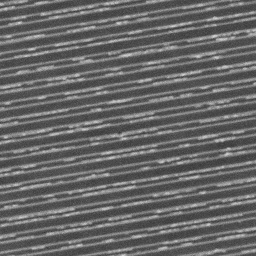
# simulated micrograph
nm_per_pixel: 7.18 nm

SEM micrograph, parallel lines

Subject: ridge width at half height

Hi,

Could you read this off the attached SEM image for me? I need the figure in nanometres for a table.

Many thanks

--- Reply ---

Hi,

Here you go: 54.9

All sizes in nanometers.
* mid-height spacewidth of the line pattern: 62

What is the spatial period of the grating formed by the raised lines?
16.4 px